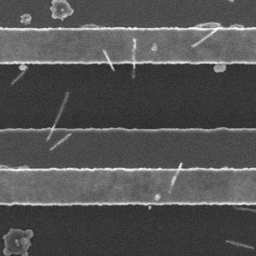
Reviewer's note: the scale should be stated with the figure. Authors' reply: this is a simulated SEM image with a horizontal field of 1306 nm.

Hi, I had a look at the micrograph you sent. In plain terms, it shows lines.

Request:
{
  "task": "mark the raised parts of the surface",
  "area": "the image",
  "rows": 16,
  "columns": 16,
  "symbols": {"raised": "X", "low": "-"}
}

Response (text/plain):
XXXXXXXXXXXXXXXX
XXXXXXXXXXXXXXXX
XXXXXXXXXXXXXXXX
XXXXXXXXXXXXXXXX
----------------
----------------
----------------
----------------
XXXXXXXXXXXXXXXX
XXXXXXXXXXXXXXXX
XXXXXXXXXXXXXXXX
XXXXXXXXXXXXXXXX
XXXXXXXXXXXXXXXX
----------------
----------------
----------------